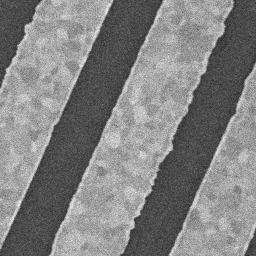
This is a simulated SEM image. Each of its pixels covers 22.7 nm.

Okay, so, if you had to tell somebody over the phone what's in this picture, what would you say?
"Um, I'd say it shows one or a few lines or trenches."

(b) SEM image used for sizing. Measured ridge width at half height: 1460 nm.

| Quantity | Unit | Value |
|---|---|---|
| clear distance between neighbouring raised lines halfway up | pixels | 47.4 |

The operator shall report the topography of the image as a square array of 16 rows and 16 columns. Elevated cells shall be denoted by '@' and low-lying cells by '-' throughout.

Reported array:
--@@@@@---@@@@--
--@@@@----@@@@--
-@@@@@---@@@@@--
-@@@@----@@@@---
@@@@@---@@@@@---
@@@@@---@@@@---@
@@@@---@@@@@---@
@@@@---@@@@----@
@@@---@@@@@---@@
@@@---@@@@----@@
@@----@@@@---@@@
@@---@@@@----@@@
@----@@@@---@@@@
@---@@@@@---@@@@
----@@@@---@@@@@
---@@@@@---@@@@-